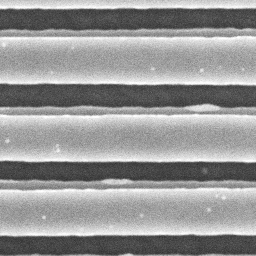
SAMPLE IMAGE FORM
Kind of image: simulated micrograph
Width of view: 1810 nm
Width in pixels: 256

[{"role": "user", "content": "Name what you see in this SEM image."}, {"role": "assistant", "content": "lines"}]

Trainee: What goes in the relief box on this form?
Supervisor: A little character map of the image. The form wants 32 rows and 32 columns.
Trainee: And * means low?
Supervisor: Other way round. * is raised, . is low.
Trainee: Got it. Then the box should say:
********************************
................................
................................
................................
********************************
********************************
********************************
********************************
********************************
********************************
................................
................................
................................
****.**..****..***.***.*****.***
********************************
********************************
********************************
********************************
********************************
********************************
................................
................................
.............***................
********************************
********************************
********************************
********************************
********************************
********************************
................................
................................
................................